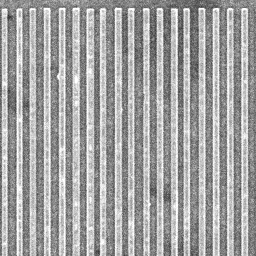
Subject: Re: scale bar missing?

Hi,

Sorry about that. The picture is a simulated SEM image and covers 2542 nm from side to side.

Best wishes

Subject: parallel lines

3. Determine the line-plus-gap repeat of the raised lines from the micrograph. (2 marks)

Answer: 140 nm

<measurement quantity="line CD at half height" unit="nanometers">53.4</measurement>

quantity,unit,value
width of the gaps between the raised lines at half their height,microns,0.0882